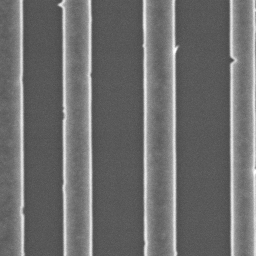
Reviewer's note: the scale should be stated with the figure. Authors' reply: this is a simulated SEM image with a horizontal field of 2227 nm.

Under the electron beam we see one or a few lines or trenches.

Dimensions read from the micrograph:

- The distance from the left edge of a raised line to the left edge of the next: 721 nm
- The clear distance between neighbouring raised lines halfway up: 472 nanometers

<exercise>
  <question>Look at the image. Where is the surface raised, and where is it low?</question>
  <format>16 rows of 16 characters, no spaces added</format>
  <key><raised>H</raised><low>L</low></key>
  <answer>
HLLLHHLLLHHLLLHH
HLLLHHLLLHHLLLHH
HLLLHHLLLHHLLLHH
HLLLHHLLLHHLLLLH
HLLLHHLLLHHLLLHH
HLLLHHLLLHHLLLHH
HLLLHHLLLHHLLLLH
HLLLHHLLLHHLLLLH
HLLLHHLLLHHLLLLH
HLLLHHLLLHHLLLLH
HLLLHHLLLHHLLLLH
HLLLHHLLLHHLLLLH
HLLLHHLLLHHLLLLH
HLLLHHLLLHHLLLLH
HLLLHHLLLHHLLLLH
HLLLHHLLLHHLLLLH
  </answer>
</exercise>